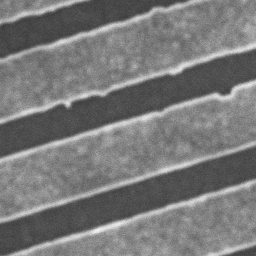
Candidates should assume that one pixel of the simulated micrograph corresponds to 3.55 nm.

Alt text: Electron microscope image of one or a few lines or trenches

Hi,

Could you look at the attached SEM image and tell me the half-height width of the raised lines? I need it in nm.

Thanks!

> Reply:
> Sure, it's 216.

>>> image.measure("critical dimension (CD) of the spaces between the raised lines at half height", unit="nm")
119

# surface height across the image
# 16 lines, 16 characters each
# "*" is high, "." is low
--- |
****......******
.......*********
....************
.*************..
***********.....
*******........*
****.......*****
*.......********
.....***********
.**************.
***********.....
********.......*
*****.......****
*........*******
.....***********
..*************.